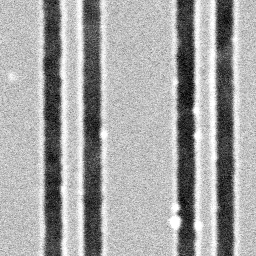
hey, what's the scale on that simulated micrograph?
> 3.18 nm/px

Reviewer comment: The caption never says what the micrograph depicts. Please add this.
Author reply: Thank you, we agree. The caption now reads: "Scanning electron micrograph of lines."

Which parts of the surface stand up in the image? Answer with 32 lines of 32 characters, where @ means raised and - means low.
@@@@@---@@---@@@@@@@@@--@@@--@@@
@@@@@---@@---@@@@@@@@@--@@@--@@@
@@@@@---@@---@@@@@@@@@--@@@--@@@
@@@@@---@@---@@@@@@@@@--@@@--@@@
@@@@@---@@---@@@@@@@@@--@@@--@@@
@@@@@---@@---@@@@@@@@@--@@@--@@@
@@@@@---@@---@@@@@@@@@---@@--@@@
@@@@@---@@---@@@@@@@@@---@@--@@@
@@@@@---@@---@@@@@@@@@--@@@--@@@
@@@@@---@@---@@@@@@@@@--@@@--@@@
@@@@@---@@---@@@@@@@@@--@@@--@@@
@@@@@---@@---@@@@@@@@@---@@--@@@
@@@@@---@@---@@@@@@@@@---@@--@@@
@@@@@---@@---@@@@@@@@@--@@@--@@@
@@@@@---@@---@@@@@@@@@--@@@--@@@
@@@@@---@@---@@@@@@@@@---@@--@@@
@@@@@---@@---@@@@@@@@@--@@@--@@@
@@@@@---@@---@@@@@@@@@--@@@--@@@
@@@@@---@@---@@@@@@@@@--@@@--@@@
@@@@@---@@---@@@@@@@@@---@@--@@@
@@@@@---@@---@@@@@@@@@---@@--@@@
@@@@@---@@---@@@@@@@@@---@@--@@@
@@@@@---@@---@@@@@@@@@---@@--@@@
@@@@@---@@---@@@@@@@@@---@@--@@@
@@@@@---@@---@@@@@@@@@---@@--@@@
@@@@@---@@---@@@@@@@@@--@@@--@@@
@@@@@---@@---@@@@@@@@@---@@--@@@
@@@@@---@@---@@@@@@@@@---@@--@@@
@@@@@@--@@---@@@@@@@@@--@@@--@@@
@@@@@---@@---@@@@@@@@@---@@--@@@
@@@@@---@@---@@@@@@@@@---@@--@@@
@@@@@---@@---@@@@@@@@@---@@--@@@